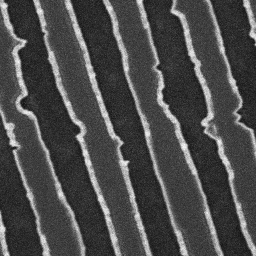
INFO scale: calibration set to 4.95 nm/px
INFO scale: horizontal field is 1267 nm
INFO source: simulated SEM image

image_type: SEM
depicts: one or a few lines or trenches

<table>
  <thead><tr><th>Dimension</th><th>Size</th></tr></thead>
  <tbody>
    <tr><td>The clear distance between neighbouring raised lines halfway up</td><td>31.5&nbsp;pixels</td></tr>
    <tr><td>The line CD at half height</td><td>169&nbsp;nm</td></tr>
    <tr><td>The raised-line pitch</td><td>326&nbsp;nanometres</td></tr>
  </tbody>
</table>